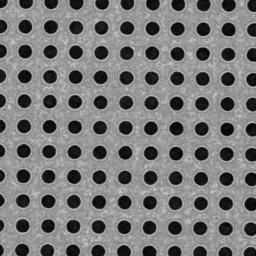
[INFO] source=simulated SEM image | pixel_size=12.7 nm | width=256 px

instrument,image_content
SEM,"a regular array of holes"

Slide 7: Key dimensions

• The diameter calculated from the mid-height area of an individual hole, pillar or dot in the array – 14.3 px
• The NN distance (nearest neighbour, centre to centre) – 316 nanometers